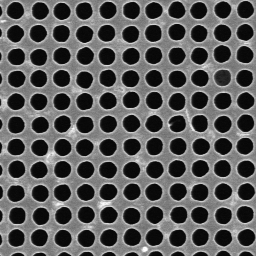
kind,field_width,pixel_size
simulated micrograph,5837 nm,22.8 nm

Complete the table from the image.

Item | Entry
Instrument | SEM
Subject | a regular array of holes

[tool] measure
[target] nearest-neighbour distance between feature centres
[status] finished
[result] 505 nm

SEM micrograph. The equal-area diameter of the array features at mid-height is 0.399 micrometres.